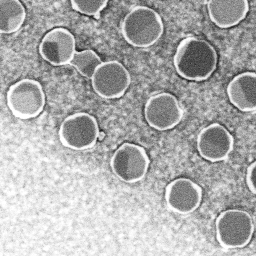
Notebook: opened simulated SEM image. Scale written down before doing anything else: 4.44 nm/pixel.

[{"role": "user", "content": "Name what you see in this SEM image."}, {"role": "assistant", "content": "a regular array of raised bodies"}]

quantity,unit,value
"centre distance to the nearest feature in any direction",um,0.27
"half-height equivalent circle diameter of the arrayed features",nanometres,163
